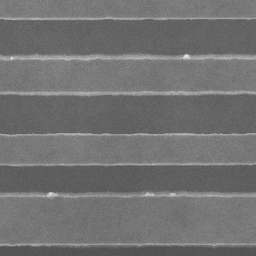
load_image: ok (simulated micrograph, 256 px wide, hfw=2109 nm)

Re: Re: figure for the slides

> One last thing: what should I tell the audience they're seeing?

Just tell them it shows lines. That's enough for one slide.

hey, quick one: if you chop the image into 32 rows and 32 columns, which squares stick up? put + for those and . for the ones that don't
++++++++++++++++++++++++++++++++
++++++++++++++++++++++++++++++++
................................
................................
................................
................................
................................
++++++++++++++++++++++++++++++++
++++++++++++++++++++++++++++++++
++++++++++++++++++++++++++++++++
++++++++++++++++++++++++++++++++
++++++++++++++++++++++++++++++.+
................................
................................
................................
................................
................................
++++++++++++++++++++++++++++++++
++++++++++++++++++++++++++++++++
++++++++++++++++++++++++++++++++
++++++++++++++++++++..++.+......
................................
................................
................................
++...+++...+++...+++++++++++.+++
++++++++++++++++++++++++++++++++
++++++++++++++++++++++++++++++++
++++++++++++++++++++++++++++++++
++++++++++++++++++++++++++++++++
++++++++++++++++++++++++++++++++
++++++++++++++++++++++++++++++++
................................